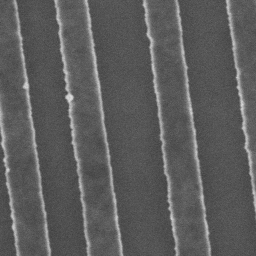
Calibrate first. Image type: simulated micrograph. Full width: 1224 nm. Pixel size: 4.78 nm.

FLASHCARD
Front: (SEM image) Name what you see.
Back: lines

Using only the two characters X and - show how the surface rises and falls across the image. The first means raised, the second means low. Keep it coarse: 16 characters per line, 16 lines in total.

X---XX---XX---XX
X---XX---XX---XX
X---XX---XX----X
X---XX---XXX---X
XX--XX----XX---X
XX--XX----XX---X
XX--XX----XX---X
XX--XXX---XX---X
XX---XX---XX---X
XX---XX---XX---X
XX---XX---XX----
XXX--XX---XXX---
-XX--XX----XX---
-XX--XX----XX---
-XX--XX----XX---
-XX--XXX---XX---